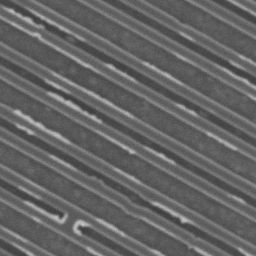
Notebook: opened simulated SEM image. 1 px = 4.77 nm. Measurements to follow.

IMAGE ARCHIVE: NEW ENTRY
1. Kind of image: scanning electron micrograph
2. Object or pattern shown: parallel lines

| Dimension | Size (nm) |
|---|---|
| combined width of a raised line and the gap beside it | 127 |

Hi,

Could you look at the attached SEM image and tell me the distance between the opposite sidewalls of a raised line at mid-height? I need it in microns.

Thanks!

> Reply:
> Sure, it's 0.0562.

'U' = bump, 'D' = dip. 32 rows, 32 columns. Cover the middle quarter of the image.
DDDDDUUUUUUUDDDDUUUUUUDDDDDDDDDD
DDDDDDDUUUUUUDDDDDUUUUUUDDDDDDDD
DDDDDDDDDUUUUUUDDDDDUUUUUUDDDDDD
DDDDDDDDDDDUUUUUUDDDDDUUUUUDDDDD
UUDDDDDDDDDDDUUUUUDDDDDUUUUUUDDD
UUUDDDDDDDDDDDUUUUUUDDDDDUUUUUDD
UUUUUUDDDDDDDDDDDUUUUUDDDDDUUUUU
DUUUUUUUDDDDDDDDDDUUUUUUDDDDDUUU
DDDUUUUUUDDDDDDDDDDDUUUUUUDDDDUU
UUDDDUUUUUUDDDDDDDDDDDUUUUUDDDDD
UUUDDDDUUUUUUDDDDDDDDDDDUUUUUUDD
UUUUUDDDDUUUUUUDDDDDDDDDDUUUUUUU
UUUUUUDDDDDUUUUUUDDDDDDDDDDUUUUU
DDUUUUUUDDDDUUUUUUDDDDDDDDDDDUUU
DDDUUUUUUUDDDDUUUUUDDDDDDDDDDDUU
DDDDDUUUUUUDDDDDUUUUUDDDDDDDDDDD
DDDDDDDUUUUUUDDDDDUUUUUDDDDDDDDD
DDDDDDDDDUUUUUUDDDDUUUUUUDDDDDDD
DDDDDDDDDDDUUUUUDDDDDUUUUUUDDDDD
UUDDDDDDDDDDUUUUUUDDDDDUUUUUDDDD
UUUDDDDDDDDDDDUUUUUUDDDDDUUUUUDD
UUUUUDDDDDDDDDDDUUUUUUDDDDDUUUUU
DUUUUUUDDDDDDDDDDUUUUUUUUDDDUUUU
DDDUUUUUUDDDDDDDDDDUUUUUUUDDDDUU
DDDDDUUUUUDDDDDDDDDDDUUUUUUUDDDD
UUDDDDUUUUUUDDDDDDDDDDDUUUUUUDDD
UUUDDDDDUUUUUUDDDDDDDDDDDUUUUUUD
UUUUUDDDDDUUUUUUDDDDDDDDDDDUUUUU
DUUUUUUUDDDDUUUUUUDDDDDDDDDDUUUU
DDDUUUUUUUDDDDUUUUUDDDDDDDDDDDUU
DDDDDUUUUUUDDDDUUUUUUDDDDDDDDDDD
DDDDDDDUUUUUDDDDDUUUUUDDDDDDDDDD